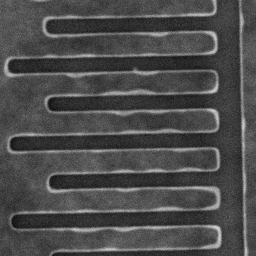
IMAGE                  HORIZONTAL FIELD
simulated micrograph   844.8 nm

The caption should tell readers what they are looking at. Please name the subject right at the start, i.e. groups of lines, slits or small figures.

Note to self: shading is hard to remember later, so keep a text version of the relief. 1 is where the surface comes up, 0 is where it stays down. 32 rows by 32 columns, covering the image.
11111111111111111111111111100011
11111111111111111111111111100011
11111100000000000000000000000011
11111100000000000000000000000011
11111111111111111111111111100011
11111111111111111111111111100011
11111111111111111111111111100011
10000000000000000000000000000011
10000000000000000000000000000011
11111111111111111111111111100011
11111111111111111111111111100011
11111111111111111111111111100011
11111100000000000000000000000011
11111100000000000000000000000011
11111111111111111111111111100011
11111111111111111111111111100011
11111111111111110000001100000011
10000000000000000000000000000011
10000000000000000000000000000011
11111111111111111111111111100011
11111111111111111111111111100011
11111111111111101100000000000011
11111100000000000000000000000001
11111100000000000000000000000001
11111111111111111111111111100011
11111111111111111111111111100011
11111111110000000000000000000001
10000000000000000000000000000001
11000000000001001111111111100001
11111111111111111111111111100001
11111111111111111111111111100001
11111110000000000000000000000001